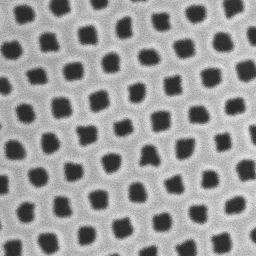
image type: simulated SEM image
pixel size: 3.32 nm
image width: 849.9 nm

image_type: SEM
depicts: a regular array of holes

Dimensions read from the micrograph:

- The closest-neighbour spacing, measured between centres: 0.12 micrometres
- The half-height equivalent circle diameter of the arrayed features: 70.6 nanometers